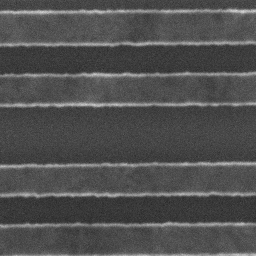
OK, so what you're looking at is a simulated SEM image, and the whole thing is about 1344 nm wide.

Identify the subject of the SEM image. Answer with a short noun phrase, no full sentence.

lines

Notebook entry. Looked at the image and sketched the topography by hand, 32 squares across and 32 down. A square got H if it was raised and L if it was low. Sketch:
LLLLLLLLLLLLLLLLLLLLLLLLLLLLLLLL
HHHHHHHHHHHHHHHHHHHHHHHHHHHHHHHH
HHHHHHHHHHHHHHHHHHHHHHHHHHHHHHHH
HHHHHHHHHHHHHHHHHHHHHHHHHHHHHHHH
HHHHHHHHHHHHHHHHHHHHHHHHHHHHHHHH
HHHHHHHHHHHHHHHHHHHHHHHHHHHHHHLL
LLLLLLLLLLLLLLLLLLLLLLLLLLLLLLLL
LLLLLLLLLLLLLLLLLLLLLLLLLLLLLLLL
LLLLLLLLLLLLLLLLLLLLLLLLLLLLLLLL
HHHHHHHHHHHHHHHHHHHHHHHHHHHHHHHH
HHHHHHHHHHHHHHHHHHHHHHHHHHHHHHHH
HHHHHHHHHHHHHHHHHHHHHHHHHHHHHHHH
HHHHHHHHHHHHHHHHHHHHHHHHHHHHHHHH
LLLLLLLLLLLLLLLLLLLLLLLLLLLLLLLL
LLLLLLLLLLLLLLLLLLLLLLLLLLLLLLLL
LLLLLLLLLLLLLLLLLLLLLLLLLLLLLLLL
LLLLLLLLLLLLLLLLLLLLLLLLLLLLLLLL
LLLLLLLLLLLLLLLLLLLLLLLLLLLLLLLL
LLLLLLLLLLLLLLLLLLLLLLLLLLLLLLLL
LLLLLLLLLLLLLLLLLLLLLLLLLLLLLLLL
LLLLLLLLLLLLHHHHLHHHHHHHHHHHHHHH
HHHHHHHHHHHHHHHHHHHHHHHHHHHHHHHH
HHHHHHHHHHHHHHHHHHHHHHHHHHHHHHHH
HHHHHHHHHHHHHHHHHHHHHHHHHHHHHHHH
HHLLHHLLLLLLHHLLLLLLLLLLLLLLLLLL
LLLLLLLLLLLLLLLLLLLLLLLLLLLLLLLL
LLLLLLLLLLLLLLLLLLLLLLLLLLLLLLLL
LLLLLLLLLLLLLLLLLLLLLLLLLLLLLLLL
HHHHHHHHHHHHHHHHHHHHHHHHHHHHHHHH
HHHHHHHHHHHHHHHHHHHHHHHHHHHHHHHH
HHHHHHHHHHHHHHHHHHHHHHHHHHHHHHHH
HHHHHHHHHHHHHHHHHHHHHHHHHHHHHHHH